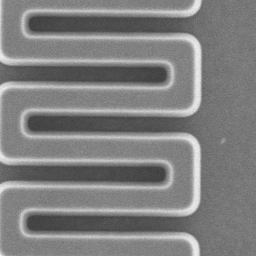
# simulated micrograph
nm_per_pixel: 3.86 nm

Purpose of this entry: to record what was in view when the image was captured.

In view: groups of lines, slits or small figures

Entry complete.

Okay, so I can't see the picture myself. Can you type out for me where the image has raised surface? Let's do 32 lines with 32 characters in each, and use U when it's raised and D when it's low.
UUUUUUUUUUUUUUUUUUUUUUUUUDDDDDDD
UUUUUUUUUUUUUUUUUUUUUUUUDDDDDDDD
UUUDDDDDDDDDDDDDDDDDDDDDDDDDDDDD
UUUDDDDDDDDDDDDDDDDDDDDDDDDDDDDD
UUUUUUUUUUUUUUUDDDDDDDDDDDDDDDDD
UUUUUUUUUUUUUUUUUUUUUUUUUDDDDDDD
UUUUUUUUUUUUUUUUUUUUUUUUUDDDDDDD
UUUUUUUUUUUUUUUUUUUUUUUUUDDDDDDD
DDDDDDDDDDDDDDDDDDDDDUUUUDDDDDDD
DDDDDDDDDDDDDDDDDDDDDUUUUDDDDDDD
DDDDDDDDDDDDDDDDDDDDDUUUUDDDDDDD
UUUUUUUUUUUUUUUUUUUUUUUUUDDDDDDD
UUUUUUUUUUUUUUUUUUUUUUUUUDDDDDDD
UUUUUUUUUUUUUUUUUUUUUUUUDDDDDDDD
UUUDDDDDDDDDDDDDDDDDDDDDDDDDDDDD
UUUDDDDDDDDDDDDDDDDDDDDDDDDDDDDD
UUUUDDDDDDDDDDDDDDDDDDDDDDDDDDDD
UUUUUUUUUUUUUUUUUUUUUUUUDDDDDDDD
UUUUUUUUUUUUUUUUUUUUUUUUUDDDDDDD
UUUUUUUUUUUUUUUUUUUUUUUUUDDDDDDD
DDDDDDDDDDDDDDDDDDDDUUUUUDDDDDDD
DDDDDDDDDDDDDDDDDDDDDUUUUDDDDDDD
DDDDDDDDDDDDDDDDDDDDDUUUUDDDDDDD
UUUUUUUUUUUUUUUUUUUUUUUUUDDDDDDD
UUUUUUUUUUUUUUUUUUUUUUUUUDDDDDDD
UUUUUUUUUUUUUUUUUUUUUUUUDDDDDDDD
UUUUUUUUUUUUUUUUUUUUUUUUDDDDDDDD
UUUDDDDDDDDDDDDDDDDDDDDDDDDDDDDD
UUUDDDDDDDDDDDDDDDDDDDDDDDDDDDDD
UUUUUUUUUUUUUUUUUUUUUUUDDDDDDDDD
UUUUUUUUUUUUUUUUUUUUUUUUDDDDDDDD
UUUUUUUUUUUUUUUUUUUUUUUUDDDDDDDD